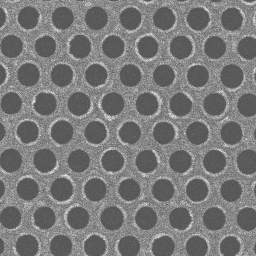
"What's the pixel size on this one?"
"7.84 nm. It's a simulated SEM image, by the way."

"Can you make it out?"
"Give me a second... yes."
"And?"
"a regular array of holes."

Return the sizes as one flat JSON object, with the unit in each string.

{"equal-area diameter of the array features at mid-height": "176 nanometres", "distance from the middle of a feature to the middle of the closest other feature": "258 nanometers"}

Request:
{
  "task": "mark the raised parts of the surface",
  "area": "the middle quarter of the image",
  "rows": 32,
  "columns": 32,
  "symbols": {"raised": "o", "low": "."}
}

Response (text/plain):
.ooooo....ooooo...oooooo..oooooo
..oooo....oooo.....oooo....oooo.
..ooo......ooo.....ooo......ooo.
..ooo......ooo.....ooo......ooo.
..oooo....oooo.....oooo....oooo.
.oooooo..ooooooo.ooooooo..oooooo
oooooooooooooooooooooooooooooooo
oo...oooooo...ooooo...oooooo..oo
o.....oooo.....ooo.....oooo....o
o......oo......ooo.....ooo......
o......oo......ooo......oo......
o.....oooo.....ooo.....oooo.....
oo...oooooo...ooooo...oooooo...o
oooooooooooooooooooooooooooooooo
.oooooo..ooooooo.ooooooo..oooooo
..oooo....ooooo....oooo....oooo.
..ooo......ooo.....ooo......ooo.
..ooo......ooo.....ooo......ooo.
..ooo.....oooo.....ooo.....oooo.
.ooooo....ooooo...ooooo...oooooo
oooooooooooooooooooooooooooooooo
ooo.oooooooo.ooooooo.oooooooo.oo
oo....oooo....ooooo...ooooo....o
o.....ooo......ooo.....ooo......
o.....ooo......ooo.....ooo......
o.....oooo.....ooo.....ooo......
oo...ooooo....ooooo....oooo....o
oooooooooooooooooooooooooooooooo
ooooooo..ooooooooooooooooooooooo
..oooo....oooo....ooooo....oooo.
..ooo.....oooo.....ooo.....oooo.
..ooo......ooo.....ooo......oo..